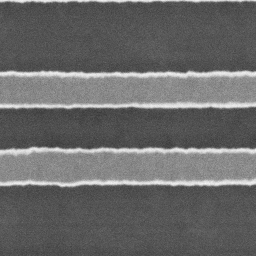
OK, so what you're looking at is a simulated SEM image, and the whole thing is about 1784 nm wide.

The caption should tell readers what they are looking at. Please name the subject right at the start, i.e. lines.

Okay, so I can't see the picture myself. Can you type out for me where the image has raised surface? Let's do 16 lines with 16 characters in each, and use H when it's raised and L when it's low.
LLLLLLLLLLLLLLLL
LLLLLLLLLLLLLLLL
LLLLLLLLLLLLLLLL
LLLLLLLLLLLLLLLL
LLLLLLLLLLLLLLLL
HHHHHHHHHHHHHHHH
HHHHHHHHHHHHHHHH
LLLLLLLLLLLLLLLL
LLLLLLLLLLLLLLLL
HHHHHHHHHHHHHHHH
HHHHHHHHHHHHHHHH
HHHHHLHLHHHHHHLL
LLLLLLLLLLLLLLLL
LLLLLLLLLLLLLLLL
LLLLLLLLLLLLLLLL
LLLLLLLLLLLLLLLL